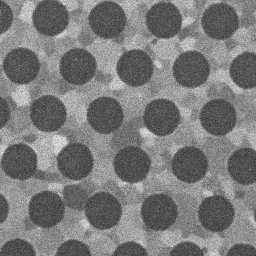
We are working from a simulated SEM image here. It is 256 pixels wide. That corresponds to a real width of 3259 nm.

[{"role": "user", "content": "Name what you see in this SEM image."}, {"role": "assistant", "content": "a regular array of holes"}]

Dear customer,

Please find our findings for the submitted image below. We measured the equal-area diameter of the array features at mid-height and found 490 nanometers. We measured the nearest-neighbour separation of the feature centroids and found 702 nm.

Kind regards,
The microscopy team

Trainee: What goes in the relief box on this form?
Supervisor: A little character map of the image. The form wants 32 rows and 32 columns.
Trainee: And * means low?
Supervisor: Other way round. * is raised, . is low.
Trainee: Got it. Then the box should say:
.****...****...****...*****..***
..**.....**.....**.....**.....**
..**.....**.....**.....**.....**
.***....***.....**.....**.....**
******.*****...****...****...***
********************************
*...****...*****..*****..*****..
.....**.....***....***....***...
.....**.....**.....***....***...
*....***....***....***....***...
**.******..*****..****...****...
********************************
.***....****...****..*****..****
.***....***....***....***....***
.***....***.....**.....**.....**
.***....***....***....***.....**
*****..*****..*****...****...***
********************************
*...****...****...****...*****.*
.....**.....**.....***....***...
.....**.....**.....**.....**....
....***....***.....**.....**....
**.******.*****...****...****...
********************************
.***....***...*****..*****..****
.***....***....***....***....***
.***....***....**.....***....***
.***....***....***....***....***
************..*****..****....***
********************************
....****...****...****..*****..*
....***....***....***.....**....